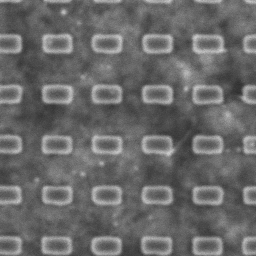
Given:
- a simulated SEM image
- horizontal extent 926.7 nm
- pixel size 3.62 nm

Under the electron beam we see a regular array of raised bodies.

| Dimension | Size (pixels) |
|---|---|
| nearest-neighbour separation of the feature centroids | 50.1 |